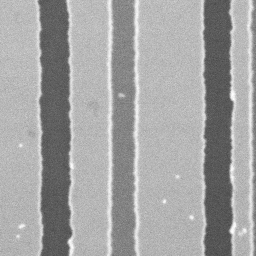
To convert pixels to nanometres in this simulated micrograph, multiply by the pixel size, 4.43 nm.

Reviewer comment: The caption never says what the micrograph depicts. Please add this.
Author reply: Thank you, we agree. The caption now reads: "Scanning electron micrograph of lines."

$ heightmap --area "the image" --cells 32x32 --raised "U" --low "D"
UUUUUDDDUUUUUUDDDUUUUUUUUDDDDUUU
UUUUUDDDDUUUUUDDDUUUUUUUUDDDDUUD
UUUUUDDDDUUUUUDDDUUUUUUUUDDDDUUD
UUUUUDDDDUUUUUDDDUUUUUUUUDDDDUUD
UUUUUDDDDUUUUUDDDUUUUUUUUDDDDUUD
UUUUUDDDDUUUUUDDDUUUUUUUUDDDDUUD
UUUUUDDDDUUUUUDDDUUUUUUUUUDDDUUD
UUUUUDDDDUUUUUDDDUUUUUUUUDDDDUUD
UUUUUDDDDUUUUUDDDUUUUUUUUDDDDUUD
UUUUUDDDDUUUUUDDDUUUUUUUUDDDDUUU
UUUUUDDDDUUUUUDDDUUUUUUUUUDDDUUD
UUUUUDDDDUUUUUDDDUUUUUUUUUDDDUUU
UUUUUDDDDUUUUUDDDUUUUUUUUUDDDUUU
UUUUUDDDDUUUUUDDDUUUUUUUUUDDDUUU
UUUUUDDDDUUUUUDDDUUUUUUUUUDDDUUD
UUUUUDDDDUUUUUDDDUUUUUUUUUDDDUUU
UUUUUDDDDUUUUUDDDUUUUUUUUDDDDUUU
UUUUUDDDDUUUUUDDDUUUUUUUUUDDDUUU
UUUUUDDDDUUUUUDDDUUUUUUUUUDDDUUU
UUUUUDDDDUUUUUDDDUUUUUUUUUDDDUUU
UUUUUDDDDUUUUUDDDUUUUUUUUDDDDUUU
UUUUUDDDDUUUUUDDDUUUUUUUUDDDDUUU
UUUUUDDDDUUUUUDDDUUUUUUUUUDDDUUU
UUUUUDDDDUUUUUDDDUUUUUUUUUDDDUUU
UUUUUDDDDUUUUUDDDUUUUUUUUUDDDUUU
UUUUUDDDDUUUUUDDDUUUUUUUUDDDDUUU
UUUUUDDDDUUUUUDDDUUUUUUUUUDDDUUU
UUUUUDDDDUUUUUDDDUUUUUUUUUDDDUUU
UUUUUDDDDUUUUUDDDUUUUUUUUUDDDUUU
UUUUUDDDDUUUUUDDDUUUUUUUUUDDDUUU
UUUUUDDDDUUUUUDDDUUUUUUUUDDDDUUU
UUUUUDDDDUUUUUDDDUUUUUUUUUDDDUUU